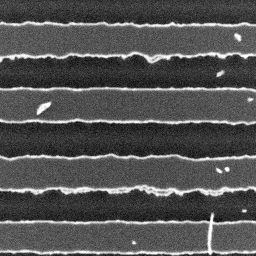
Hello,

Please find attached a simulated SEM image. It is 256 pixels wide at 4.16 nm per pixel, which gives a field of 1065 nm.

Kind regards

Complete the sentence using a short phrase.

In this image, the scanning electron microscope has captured lines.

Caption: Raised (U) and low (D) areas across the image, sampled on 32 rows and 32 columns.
DDDDDDDDDDDDDDDDDDDDDDDDDDDDDDDD
DDDDDDDDDDDDDDDDDDDDDDDDDDDDDDDD
DDDDDDDDDDDDDDDDDDDDDDDDDDDDDDDD
UUUUUUUUUUUUUUUUUUUUUUUUUUUUUUUU
UUUUUUUUUUUUUUUUUUUUUUUUUUUUUUUU
UUUUUUUUUUUUUUUUUUUUUUUUUUUUUUUU
UUUUUUUUUUUUUUUUUUUUUUUUUUUUUUUU
DDDDDDDDDDDDDDDDDDDDDDDDDDDDDDDD
DDDDDDDDDDDDDDDDDDDDDDDDDDDDDDDD
DDDDDDDDDDDDDDDDDDDDDDDDDDDDDDDD
DDDDDDDDDDDDDDDDDDDDDDDDDDDDDDDD
UUUUUUUUUUUUUUUUUUUUUUUUUUUUUUUU
UUUUUUUUUUUUUUUUUUUUUUUUUUUUUUUU
UUUUUUUUUUUUUUUUUUUUUUUUUUUUUUUU
UUUUUUUUUUUUUUUUUUUUUUUUUUUUUUUU
DDDDDDDDDDDDDDDDDDDDDDDDDDDDDUDD
DDDDDDDDDDDDDDDDDDDDDDDDDDDDDDDD
DDDDDDDDDDDDDDDDDDDDDDDDDDDDDDDD
DDDDDDDDDDDDDDDDDDDDDDDDDDDDDDDD
DDDDDUDDDDDDDUUDDDDDDUDDDDDDDDDD
UUUUUUUUUUUUUUUUUUUUUUUUUUUUUUUU
UUUUUUUUUUUUUUUUUUUUUUUUUUUUUUUU
UUUUUUUUUUUUUUUUUUUUUUUUUUUUUUUU
UUUUUUUUUUUUUUUUUDDUUUUUUUUUUUUU
DDDDDDDDDDDDDDDDDDDDDDDDDDDDDDDD
DDDDDDDDDDDDDDDDDDDDDDDDDDDDDDDD
DDDDDDDDDDDDDDDDDDDDDDDDDDDDDDDD
DDDDDDDDDDDDDDDDDDDDDDDDDDDDDDDD
UUUUUUUUUUUUUUUUUUUUUUUUUUUUUUUU
UUUUUUUUUUUUUUUUUUUUUUUUUUUUUUUU
UUUUUUUUUUUUUUUUUUUUUUUUUUUUUUUU
DUDDUUUUUUUUUUUUUUUUUUUUUUUUUUUU